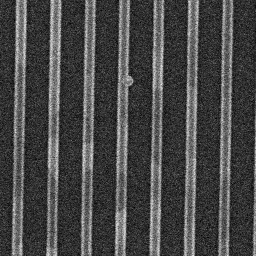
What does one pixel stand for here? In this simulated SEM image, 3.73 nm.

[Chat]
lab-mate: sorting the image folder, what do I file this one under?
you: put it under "parallel lines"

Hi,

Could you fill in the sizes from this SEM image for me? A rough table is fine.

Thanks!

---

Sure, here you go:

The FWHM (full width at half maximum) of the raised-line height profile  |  0.0293 um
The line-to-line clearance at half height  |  98.3 nanometres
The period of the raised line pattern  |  128 nm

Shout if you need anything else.